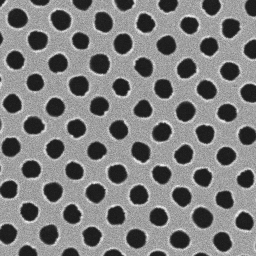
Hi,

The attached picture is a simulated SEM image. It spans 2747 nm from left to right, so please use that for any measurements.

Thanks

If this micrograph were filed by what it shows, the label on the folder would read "a regular array of holes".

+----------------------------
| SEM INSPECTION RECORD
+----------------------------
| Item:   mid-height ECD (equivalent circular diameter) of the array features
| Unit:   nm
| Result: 202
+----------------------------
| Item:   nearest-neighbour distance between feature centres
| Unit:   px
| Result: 29.5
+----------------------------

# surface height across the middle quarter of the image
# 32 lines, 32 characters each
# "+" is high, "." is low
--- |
.++++++....+++++++....++++++....
+++++++....+++++++....++++++....
+++++++++.+++++++++...+++++++...
++...++++++++++++++++++++++++..+
++....+++++++...+++++++....+++++
+.....++++++....+++++++....+++++
++....++++++....+++++++....+++++
++...++++++++...+++++++....+++++
+++++++++.++++++++++++++..++++++
+++++++....++++++++..+++++++++++
+++++++....+++++++....+++++++...
++++++.....+++++++....++++++....
+++++++...++++++++....++++++....
++++++++++++++++++++++++++++....
+....++++++++..+++++++++++++++++
+....++++++.....+++++++...++++++
+....++++++.....++++++.....+++++
+....+++++++....++++++.....+++++
+++++++++++++..++++++++...++++++
+++++++..+++++++++.+++++++++++++
++++++....+++++++....++++++++..+
++++++.....++++++....+++++++....
++++++.....++++++....+++++++....
+++++++..+++++++++...+++++++....
++.++++++++++++++++.++++++++...+
+...++++++++...++++++++..+++++++
.....++++++.....++++++....++++++
+....++++++.....++++++.....+++++
+...+++++++....+++++++....++++++
++++++++++++..+++++++++...++++++
++++++....++++++++..++++++++++++
++++++....+++++++....++++++....+